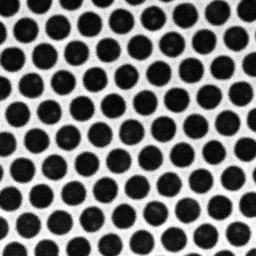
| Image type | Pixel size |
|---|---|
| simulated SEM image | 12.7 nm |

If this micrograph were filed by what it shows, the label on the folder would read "a regular array of holes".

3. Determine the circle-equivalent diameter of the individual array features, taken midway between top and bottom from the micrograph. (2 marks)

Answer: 343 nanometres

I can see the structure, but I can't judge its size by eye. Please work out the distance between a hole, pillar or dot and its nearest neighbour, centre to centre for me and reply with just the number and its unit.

402 nm